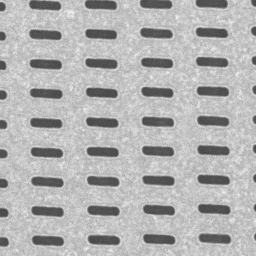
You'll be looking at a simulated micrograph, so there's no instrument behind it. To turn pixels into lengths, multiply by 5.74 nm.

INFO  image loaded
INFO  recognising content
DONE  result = a regular array of holes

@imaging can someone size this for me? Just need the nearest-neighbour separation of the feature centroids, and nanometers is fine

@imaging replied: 168